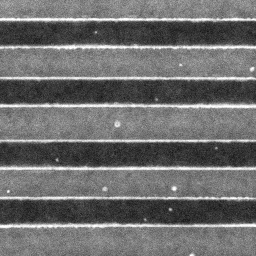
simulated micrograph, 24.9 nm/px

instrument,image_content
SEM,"lines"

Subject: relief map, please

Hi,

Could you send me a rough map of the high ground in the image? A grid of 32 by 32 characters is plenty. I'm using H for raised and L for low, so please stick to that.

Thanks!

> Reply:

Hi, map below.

LLLLLLLLLLLLLLLLLLLLLLLLLLLLLLLL
LLLLLLLLLLLLLLLLLLLLLLLLLLLLLLLL
LHHHHHHHHHHHHHHHHHHHHLHHHHHHHHHH
HHHHHHHHHHHHHHHHHHHHHHHHHHHHHHHH
HHHHHHHHHHHHHHHHHHHHHHHHHHHHHHHH
HHHHHHHHHHHHHHHHHHHHHHHHHHHHHHHH
LLLLLLLLLLLLLLLLLLLLLLLLLLLLLLLL
LLLLLLLLLLLLLLLLLLLLLLLLLLLLLLLL
LLLLLLLLLLLLLLLLLLLLLLLLLLLLLLLL
LLLLLLLLLLLLLLLLLLLLLLLLLLLLLLLL
HHHHHHHHHHHHHHHHHHHHHHHHHHHHHHHH
HHHHHHHHHHHHHHHHHHHHHHHHHHHHHHHH
HHHHHHHHHHHHHHHHHHHHHHHHHHHHHHHH
LLLLLLLLLLLLLLLLLLLLLLLLLLLLLLLL
LLLLLLLLLLLLLLLLLLLLLLLLLLLLLLLL
LLLLLLLLLLLLLLLLLLLLLLLLLLLLLLLL
LLLLLLLLLLLLLLLLLLLLLLLLLLLLLLLL
LLLLLLLLLLLLLLLLLLLLLLLLLLLLLLLL
HHHHHHHHHHHHHHHHHHHHHHHHHHHHHHHH
HHHHHHHHHHHHHHHHHHHHHHHHHHHHHHHH
HHHHHHHHHHHHHHHHHHHHHHHHHHHHHHHH
LLLLLLLLLLLLLLLLLLLLLLLLLLLLLLLL
LLLLLLLLLLLLLLLLLLLLLLLLLLLLLLLL
LLLLLLLLLLLLLLLLLLLLLLLLLLLLLLLL
LLLLLLLLLLLLLLLLLLLLLLLLLLLLLLLL
HHHHHHHHHHHHHHHHHHHHHHHHHHHHHHHH
HHHHHHHHHHHHHHHHHHHHHHHHHHHHHHHH
HHHHHHHHHHHHHHHHHHHHHHHHHHHHHHHH
LLLLLLLLLLLLLLLLLLLLLLLLLLLLLLLL
LLLLLLLLLLLLLLLLLLLLLLLLLLLLLLLL
LLLLLLLLLLLLLLLLLLLLLLLLLLLLLLLL
LLLLLLLLLLLLLLLLLLLLLLLLLLLLLLLL